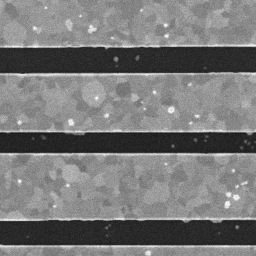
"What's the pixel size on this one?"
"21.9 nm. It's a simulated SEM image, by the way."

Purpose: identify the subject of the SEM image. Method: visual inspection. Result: lines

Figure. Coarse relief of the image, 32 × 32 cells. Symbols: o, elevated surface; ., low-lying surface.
oooooooooooooooooooooooooooooooo
oooooooooooooooooooooooooooooooo
oooooooooooooooooooooooooooooooo
oooooooooooooooooooooooooooooooo
oooooooooooooooooooooooooooooooo
oooooooooooooooooooooooooooooooo
................................
................................
................................
oooooooooooooooooooooooooooooooo
oooooooooooooooooooooooooooooooo
oooooooooooooooooooooooooooooooo
oooooooooooooooooooooooooooooooo
oooooooooooooooooooooooooooooooo
oooooooooooooooooooooooooooooooo
oooooooooooooooooooooooooooooooo
................................
................................
................................
oooooooooooooooooooooooooooooooo
oooooooooooooooooooooooooooooooo
oooooooooooooooooooooooooooooooo
oooooooooooooooooooooooooooooooo
oooooooooooooooooooooooooooooooo
oooooooooooooooooooooooooooooooo
oooooooooooooooooooooooooooooooo
oooooooooooooooooooooooooooooooo
oooooo..o.o..o..................
................................
................................
................................
oooooooooooooooooooooooooooooooo